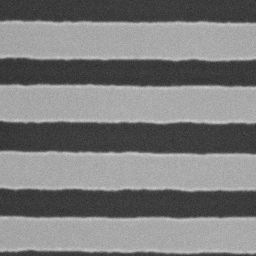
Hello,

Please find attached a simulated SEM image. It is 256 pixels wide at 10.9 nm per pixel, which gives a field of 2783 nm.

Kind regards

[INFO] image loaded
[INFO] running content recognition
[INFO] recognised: lines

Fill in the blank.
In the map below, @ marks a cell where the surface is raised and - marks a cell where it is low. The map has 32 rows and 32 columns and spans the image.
--------------------------------
--------------------------------
--------------------------------
@@@@@@@@@@@@@@@@@@@@@@@@@@@@@@@@
@@@@@@@@@@@@@@@@@@@@@@@@@@@@@@@@
@@@@@@@@@@@@@@@@@@@@@@@@@@@@@@@@
@@@@@@@@@@@@@@@@@@@@@@@@@@@@@@@@
---------------------@@--@@@@---
--------------------------------
--------------------------------
--------------------------------
@@@@@@@@@@@@@@@@@@@@@@@@@@@@@@@@
@@@@@@@@@@@@@@@@@@@@@@@@@@@@@@@@
@@@@@@@@@@@@@@@@@@@@@@@@@@@@@@@@
@@@@@@@@@@@@@@@@@@@@@@@@@@@@@@@@
--------------------------------
--------------------------------
--------------------------------
--------------------------------
@@@@@@@@@@@@@@@@@@@@@@@@@@@@@@@@
@@@@@@@@@@@@@@@@@@@@@@@@@@@@@@@@
@@@@@@@@@@@@@@@@@@@@@@@@@@@@@@@@
@@@@@@@@@@@@@@@@@@@@@@@@@@@@@@@@
-@@@@@@@@@@@@@@@@@@@@@@@@@@@@@@@
--------------------------------
--------------------------------
--------------------------------
@@@@@@@@@@@@@@@@@@@@@@@@@@@@@@@@
@@@@@@@@@@@@@@@@@@@@@@@@@@@@@@@@
@@@@@@@@@@@@@@@@@@@@@@@@@@@@@@@@
@@@@@@@@@@@@@@@@@@@@@@@@@@@@@@@@
---------------@@--@@@@@@@@@@@@@